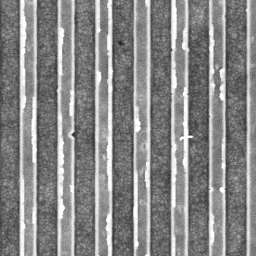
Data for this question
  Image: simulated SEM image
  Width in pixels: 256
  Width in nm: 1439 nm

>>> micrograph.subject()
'parallel lines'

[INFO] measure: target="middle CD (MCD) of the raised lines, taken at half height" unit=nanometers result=87.1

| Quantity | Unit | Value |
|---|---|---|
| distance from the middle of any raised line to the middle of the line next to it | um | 0.212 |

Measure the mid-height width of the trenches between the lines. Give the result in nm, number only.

126